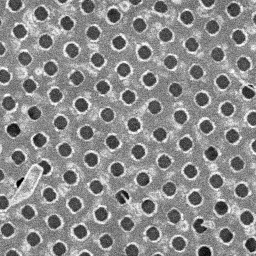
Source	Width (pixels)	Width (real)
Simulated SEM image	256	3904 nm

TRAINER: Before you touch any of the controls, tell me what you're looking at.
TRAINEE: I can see a regular array of holes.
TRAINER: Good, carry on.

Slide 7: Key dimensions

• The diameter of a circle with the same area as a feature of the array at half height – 219 nanometers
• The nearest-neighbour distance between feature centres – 415 nm